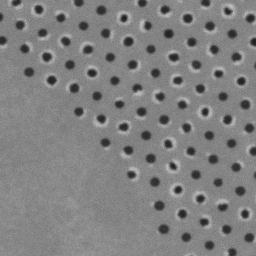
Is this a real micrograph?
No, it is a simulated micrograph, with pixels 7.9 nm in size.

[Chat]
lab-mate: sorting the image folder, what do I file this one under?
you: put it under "a regular array of holes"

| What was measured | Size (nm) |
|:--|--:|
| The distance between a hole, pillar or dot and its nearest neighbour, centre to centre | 184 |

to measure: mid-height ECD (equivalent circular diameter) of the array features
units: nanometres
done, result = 77.2